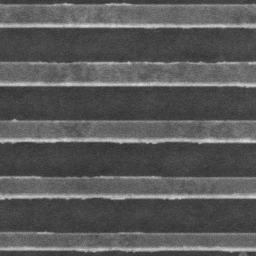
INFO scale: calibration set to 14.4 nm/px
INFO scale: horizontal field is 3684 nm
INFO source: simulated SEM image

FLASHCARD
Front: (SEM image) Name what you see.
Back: lines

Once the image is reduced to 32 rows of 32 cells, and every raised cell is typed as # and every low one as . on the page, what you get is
................................
################################
################################
................................
................................
................................
................................
................................
################################
################################
################################
................................
................................
................................
................................
################################
################################
################################
................................
................................
................................
................................
################################
################################
################################
................................
................................
................................
................................
################################
################################
................................